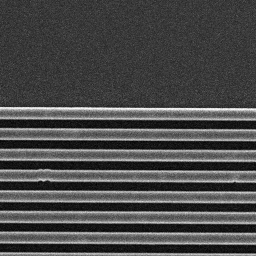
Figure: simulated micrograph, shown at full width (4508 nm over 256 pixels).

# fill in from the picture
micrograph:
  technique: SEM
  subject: parallel lines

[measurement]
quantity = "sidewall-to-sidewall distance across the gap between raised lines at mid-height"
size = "172 nm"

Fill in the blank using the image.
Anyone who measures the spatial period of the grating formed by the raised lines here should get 20.7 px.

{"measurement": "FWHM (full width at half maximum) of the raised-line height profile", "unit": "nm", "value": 205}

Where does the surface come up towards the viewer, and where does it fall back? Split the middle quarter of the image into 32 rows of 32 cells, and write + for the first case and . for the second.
................................
................................
................................
................................
................................
................................
................................
................................
................................
................................
................................
++++++++++++++++++++++++++++++++
++++++++++++++++++++++++++++++++
++++++++++++++++++++++++++++++++
................................
................................
+++++++++++++++++++++++++++++++.
++++++++++++++++++++++++++++++++
++++++++++++++++++++++++++++++++
................................
................................
++++++++++......................
++++++++++++++++++++++++++++++++
++++++++++++++++++++++++++++++++
................................
................................
................................
++++++++++++++++++++++++++++++++
++++++++++++++++++++++++++++++++
................................
................................
................................